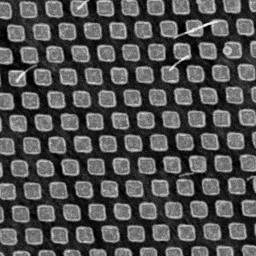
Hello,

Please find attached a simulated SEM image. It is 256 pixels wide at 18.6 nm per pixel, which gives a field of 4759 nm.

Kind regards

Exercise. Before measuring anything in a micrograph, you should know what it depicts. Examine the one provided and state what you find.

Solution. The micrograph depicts a regular array of raised bodies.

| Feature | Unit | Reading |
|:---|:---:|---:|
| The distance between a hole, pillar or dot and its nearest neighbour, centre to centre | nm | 471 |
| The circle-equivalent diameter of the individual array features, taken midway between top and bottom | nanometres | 320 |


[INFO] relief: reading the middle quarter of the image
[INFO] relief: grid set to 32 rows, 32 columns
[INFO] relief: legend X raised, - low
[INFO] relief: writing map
---------------------------X----
XX----XXX---XXX---XXXX---XXX---X
XXX---XXX---XXXX--XXXX---XXX---X
XXX---XXXX--XXXX--XXXX---XXX---X
XXX---XXXX--XXX----XXX----------
--------------------------------
-----------------------X----XXX-
--XXXX---XXX---XXXX--XXXX---XXXX
--XXXX---XXXX--XXXX---XXX---XXXX
---XXX---XXXX--XXXX---XXX---XXXX
----XX--------------------------
--------------------------------
------------XXX----XXX---XXX---X
XXX---XXXX--XXXX--XXXX---XXXX--X
XXX---XXXX--XXXX---XXX---XXXX--X
XXX---XXXX--XXXX---XXX---XXXX---
--------------------------------
--------------------------------
---XXX---XXXX--XXXX---XXX---XXXX
---XXXX--XXXX--XXXX---XXXX--XXXX
---XXXX--XXXX--XXXX---XXXX--XXXX
---XXXX---XXX---XXX----X--------
--------------------------------
-------------------------XXX----
XXX---XXXX--XXXX---XXX---XXXX---
XXXX--XXXX--XXXX---XXXX--XXXX---
XXXX--XXXX---XXX---XXXX---XXX---
XXX----XXX----X-----------------
--------------------------------
----------XXX---X-X---XXXX--XXXX
---XXXX--XXXX---XXXX--XXXX--XXXX
X--XXXX---XXX---XXXX--XXXX---XXX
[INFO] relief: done